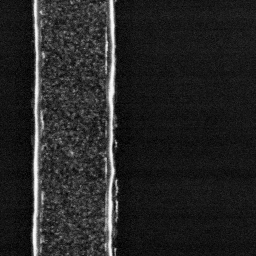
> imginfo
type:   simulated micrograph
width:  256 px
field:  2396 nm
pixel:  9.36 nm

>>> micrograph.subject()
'one or a few lines or trenches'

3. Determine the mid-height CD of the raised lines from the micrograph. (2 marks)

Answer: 75.4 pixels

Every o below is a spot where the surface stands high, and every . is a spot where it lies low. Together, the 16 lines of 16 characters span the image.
..ooooo.........
..ooooo.........
..ooooo.........
..ooooo.........
..ooooo.........
..ooooo.........
..ooooo.........
..ooooo.........
..ooooo.........
..ooooo.........
..ooooo.........
..ooooo.........
..ooooo.........
..ooooo.........
..ooooo.........
..ooooo.........